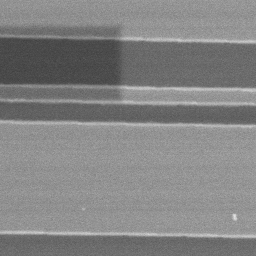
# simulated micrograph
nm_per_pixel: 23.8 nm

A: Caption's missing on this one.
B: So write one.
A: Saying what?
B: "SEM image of lines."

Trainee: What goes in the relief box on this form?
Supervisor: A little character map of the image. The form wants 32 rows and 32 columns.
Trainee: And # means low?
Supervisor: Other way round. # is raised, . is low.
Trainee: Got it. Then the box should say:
################################
################################
################################
################################
################################
................................
................................
................................
................................
................................
................................
################################
################################
................................
................................
################................
################################
################################
################################
################################
################################
################################
################################
################################
################################
################################
################################
################################
################################
................................
................................
................................